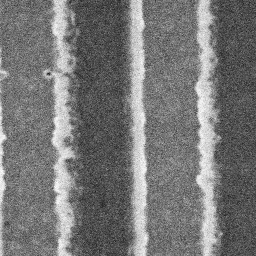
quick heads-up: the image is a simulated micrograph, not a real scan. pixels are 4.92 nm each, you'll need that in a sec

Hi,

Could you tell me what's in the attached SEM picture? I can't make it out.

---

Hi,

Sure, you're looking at one or a few lines or trenches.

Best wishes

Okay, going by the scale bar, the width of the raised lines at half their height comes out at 349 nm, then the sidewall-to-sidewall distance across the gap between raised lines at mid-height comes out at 368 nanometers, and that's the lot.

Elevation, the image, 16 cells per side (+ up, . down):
++++....+++++...
++++....+++++...
++++....+++++...
++++.....++++...
++++.....++++...
++++....+++++...
++++.....++++...
++++.....++++...
++++.....++++...
++++.....++++...
++++.....++++...
++++.....++++...
++++.....++++...
++++.....++++...
++++.....++++...
++++.....++++...